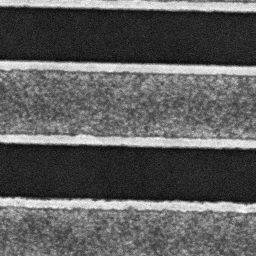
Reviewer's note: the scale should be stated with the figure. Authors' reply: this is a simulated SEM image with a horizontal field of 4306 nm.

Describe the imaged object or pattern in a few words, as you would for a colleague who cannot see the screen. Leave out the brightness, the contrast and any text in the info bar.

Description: one or a few lines or trenches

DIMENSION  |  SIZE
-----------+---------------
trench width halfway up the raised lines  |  1050 nanometres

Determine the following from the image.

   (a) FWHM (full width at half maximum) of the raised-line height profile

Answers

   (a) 1250 nanometres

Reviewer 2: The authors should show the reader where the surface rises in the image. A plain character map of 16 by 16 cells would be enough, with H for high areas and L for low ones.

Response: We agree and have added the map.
LLLLLLLLLLLLLLLH
LLLLLLLLLLLLLLLL
LLLLLLLLLLLLLLLL
LLLLLLLLLLLLLLLL
HHHHHHHHHHHHHHHH
HHHHHHHHHHHHHHHH
HHHHHHHHHHHHHHHH
HHHHHHHHHHHHHHHH
HHHHHHHHHHHHHHHH
LLLLLLLLLLLLLLLL
LLLLLLLLLLLLLLLL
LLLLLLLLLLLLLLLL
LLLLLLLLLLLLLLLL
HHHHHHHHHHHHHHHH
HHHHHHHHHHHHHHHH
HHHHHHHHHHHHHHHH